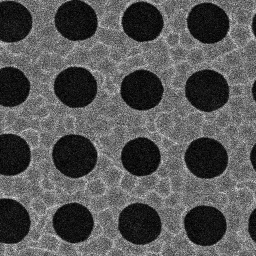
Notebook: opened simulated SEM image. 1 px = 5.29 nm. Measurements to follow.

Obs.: a regular array of holes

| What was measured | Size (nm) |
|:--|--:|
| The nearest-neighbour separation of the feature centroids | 347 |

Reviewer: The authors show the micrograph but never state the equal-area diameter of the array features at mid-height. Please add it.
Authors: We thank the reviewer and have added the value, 221 nm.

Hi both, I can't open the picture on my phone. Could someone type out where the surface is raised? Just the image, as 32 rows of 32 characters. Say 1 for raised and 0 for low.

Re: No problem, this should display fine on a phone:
00011111000111111001111110011111
00001110000011110000111100001111
00001110000011100000111000000111
00001110000011100000111000000111
00011111000111110000111100001111
11111111111111111111111111111111
11111111111111111111111111111111
11111111111111111111111111111111
00111111101111111111111111111111
00011110000011110000111100001111
00001110000011100000111000001111
00001110000011100000111000000110
00011110000011100000111100001111
11111111101111110001111100011111
11111111111111111111111111111111
11111111111111111111111111111111
11111111111111111111111111111111
00011110000111110001111100011111
00001110000011100000111000001111
00001110000011100000111000001110
00001110000011100000111000001110
00011111000111110001111100001111
11111111111111111111111111111111
11111111111111111111111111111111
11111111111111111111111111111111
00011111001111110011111111111111
00011110000111100000111100001111
00001110000011100000111000001110
00001110000011100000111000001110
00011110000111100000111000001110
11111111111111111011111110011111
11111111111111111111111111111111